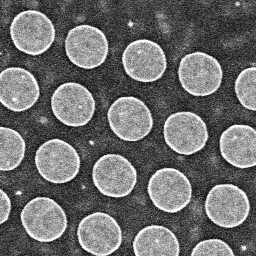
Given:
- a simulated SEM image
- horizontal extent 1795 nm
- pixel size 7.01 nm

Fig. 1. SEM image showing a regular array of raised bodies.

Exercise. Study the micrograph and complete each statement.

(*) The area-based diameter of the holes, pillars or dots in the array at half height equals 299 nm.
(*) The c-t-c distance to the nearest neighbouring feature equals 0.402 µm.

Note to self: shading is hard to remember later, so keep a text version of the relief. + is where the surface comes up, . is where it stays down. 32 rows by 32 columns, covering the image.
................................
...+............................
..++++..........................
.++++++..+++....................
..+++++.+++++...................
..++++..+++++...+++.............
...++...+++++...++++............
.........++++..++++++..++++.....
.+..............+++++.++++++....
++++............++++..++++++..++
+++++...++.............++++..+++
+++++..++++.............+++...++
++++...+++++...++.............++
.++....+++++..++++.............+
.......++++...+++++..++++.......
........++....+++++..+++++......
++............+++++..+++++..++++
+++.............+....+++++..++++
+++..++++.............+++...++++
+++..+++++...++.............++++
++...+++++..++++.............+++
.....+++++..+++++...++..........
......+++...+++++..++++.........
............+++++..+++++...+++..
+.............+....+++++..+++++.
+..++++............++++...+++++.
+..+++++..................+++++.
+..+++++..++++............++++..
...+++++..+++++...+++...........
....+++...+++++..+++++..........
..........+++++..+++++...+++....
...........+++...+++++..+++++...